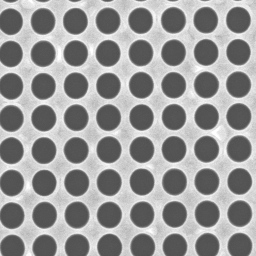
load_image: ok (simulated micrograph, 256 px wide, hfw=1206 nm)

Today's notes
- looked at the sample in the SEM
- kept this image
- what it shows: a regular array of holes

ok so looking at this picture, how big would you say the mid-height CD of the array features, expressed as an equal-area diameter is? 0.118 µm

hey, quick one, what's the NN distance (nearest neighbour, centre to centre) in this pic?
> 32.2 pixels